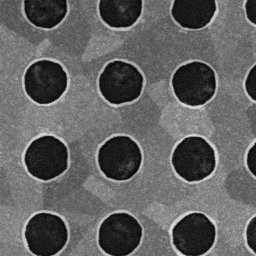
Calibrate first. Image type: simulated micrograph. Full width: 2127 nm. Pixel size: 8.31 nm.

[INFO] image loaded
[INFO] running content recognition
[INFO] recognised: holes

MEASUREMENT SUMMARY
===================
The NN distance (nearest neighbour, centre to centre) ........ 609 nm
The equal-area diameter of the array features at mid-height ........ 380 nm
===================